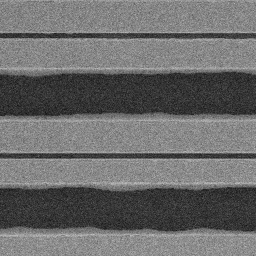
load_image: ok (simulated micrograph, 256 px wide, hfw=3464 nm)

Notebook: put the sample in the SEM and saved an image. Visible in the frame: lines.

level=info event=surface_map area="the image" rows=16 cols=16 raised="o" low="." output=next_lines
oooooooooooooooo
oooooooooooooooo
oooooooooooooooo
oooooooooooooooo
................
................
................
oooooooooooooooo
oooooooooooooooo
oooooooooooooooo
oooooooooooooooo
oooooooooooooooo
................
................
................
oooooooooooooooo